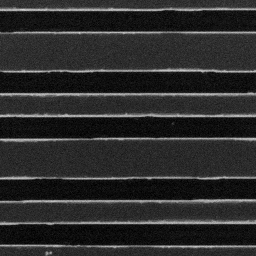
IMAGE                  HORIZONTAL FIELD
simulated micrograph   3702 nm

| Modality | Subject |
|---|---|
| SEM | lines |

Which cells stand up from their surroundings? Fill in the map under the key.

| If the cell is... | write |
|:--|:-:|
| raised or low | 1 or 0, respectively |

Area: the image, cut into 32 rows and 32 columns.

11111111111111111111111111111111
00000000000000000000000000000000
00000000000000000000000000000000
00000000000000000000000000000000
11111111111111111111111111111111
11111111111111111111111111111111
11111111111111111111111111111111
11111111111111111111111111111111
11111111111111111111111111111111
00000000000000000000000000000000
00000000000000000000000000000000
00000000000000000000000000000000
11111111111111111111111111111111
11111111111111111111111111111111
11111111111111111101111111111111
00000000000000000000000000000000
00000000000000000000000000000000
11111111111111111111111111111111
11111111111111111111111111111111
11111111111111111111111111111111
11111111111111111111111111111111
11111111111111111111111111111111
00000000000000000000000000000000
00000000000000000000000000000000
00000000000000000000000000000000
11111111111111111111111111111111
11111111111111111111111111111111
11111111111111111111111111111111
00000000000000000000000000000000
00000000000000000000000000000000
00000000000000000000000000000000
11111111111111111111111111111111